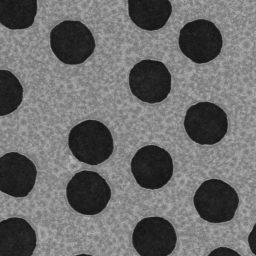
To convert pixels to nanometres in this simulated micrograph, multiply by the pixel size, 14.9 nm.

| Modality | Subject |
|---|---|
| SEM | a regular array of holes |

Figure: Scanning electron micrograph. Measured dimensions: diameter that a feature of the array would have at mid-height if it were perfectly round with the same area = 657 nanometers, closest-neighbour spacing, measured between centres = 0.97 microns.